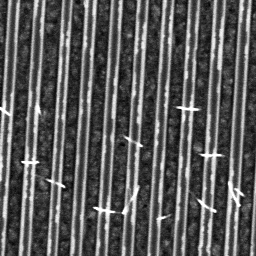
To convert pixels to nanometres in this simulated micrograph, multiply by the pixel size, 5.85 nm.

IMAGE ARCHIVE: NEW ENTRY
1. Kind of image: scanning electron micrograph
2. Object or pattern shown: parallel lines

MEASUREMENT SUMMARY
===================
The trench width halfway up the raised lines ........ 0.0934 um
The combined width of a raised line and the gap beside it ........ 150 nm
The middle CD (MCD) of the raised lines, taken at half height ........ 55.4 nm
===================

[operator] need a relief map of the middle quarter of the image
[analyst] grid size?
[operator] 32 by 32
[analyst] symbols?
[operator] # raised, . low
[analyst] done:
#....##....##.....##....##....##
#....##....##.....##....##....##
#....##....##.....##....##....##
#....##....##.....##....##....##
#...###....##....###....##....##
....###....##....###....##....##
....###....##....##.....##....##
....##.....##....##.....##....##
....##.....##....##.....##....##
....##.....##....##.....##....##
....##....###....##....###....##
....##....###....##....###....##
....##....###....##....##.....##
....##....##.....##....##.....##
....##....##.....##....##.....##
....##....##.....##....##.....##
....##....##.....##....##....###
....##....##.....##....##....###
....##....##....###....##....##.
....##....##.....##....##....##.
....##....##....###....##....##.
...###....##....###....##....##.
...###....##....###....##....##.
...##.....##....##.....##....##.
...##.....##....##.....##....##.
...##.....##....##.....##....##.
...##.....##....##....###....##.
...##....###....##....###....##.
...##....###....##....###....##.
...##....##.....##....##.....##.
...##....##.....##....##.....##.
...##....##.....##....##.....##.